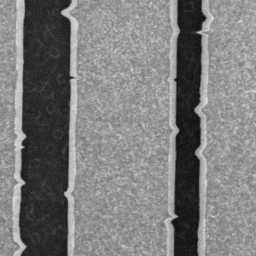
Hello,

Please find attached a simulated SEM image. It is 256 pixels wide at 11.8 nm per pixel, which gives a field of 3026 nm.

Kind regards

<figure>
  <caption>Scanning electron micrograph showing one or a few lines or trenches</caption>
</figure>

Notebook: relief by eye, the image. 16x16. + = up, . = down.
+...+++++++..+++
+....++++++..+++
+....++++++..+++
+....++++++..+++
+....++++++..+++
+....++++++..+++
+....++++++..+++
+....++++++..+++
+....++++++..+++
+...+++++++..+++
+...+++++++..+++
+...+++++++..+++
+...+++++++..+++
+...+++++++..+++
+...+++++++..+++
+...+++++++..+++